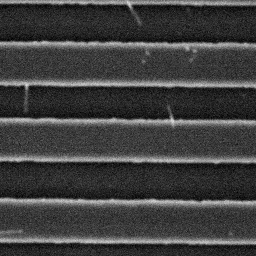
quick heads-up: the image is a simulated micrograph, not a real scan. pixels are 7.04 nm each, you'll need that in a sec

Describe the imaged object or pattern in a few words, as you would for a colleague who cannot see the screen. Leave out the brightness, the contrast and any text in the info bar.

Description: lines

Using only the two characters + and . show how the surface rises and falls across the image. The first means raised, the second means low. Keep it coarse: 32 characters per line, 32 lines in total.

................+.....+.++++++++
................................
................................
................................
................................
+++++++++++++++++++++.+++++++++.
++++++++++++++++++++++++++++++++
++++++++++++++++++++++++++++++++
++++++++++++++++++++++++++++++++
++++++++++++++++++++++++++++++++
++++++++++++++++++++++++++++++++
................................
................................
................................
................................
++++++++++++++++++++++++++++++++
++++++++++++++++++++++++++++++++
++++++++++++++++++++++++++++++++
++++++++++++++++++++++++++++++++
++++++++++++++++++++++++++++++++
................................
................................
................................
................................
................................
++++++++++++++++++++++++++++++++
++++++++++++++++++++++++++++++++
++++++++++++++++++++++++++++++++
++++++++++++++++++++++++++++++++
++++++++++++++++++++++++++++++++
................................
................................